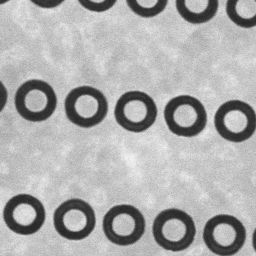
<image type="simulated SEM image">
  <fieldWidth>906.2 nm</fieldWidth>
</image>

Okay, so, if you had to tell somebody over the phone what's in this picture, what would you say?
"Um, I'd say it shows a regular array of ring-shaped grooves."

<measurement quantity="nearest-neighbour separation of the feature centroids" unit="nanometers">177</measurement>